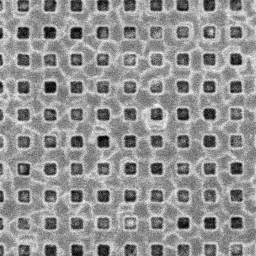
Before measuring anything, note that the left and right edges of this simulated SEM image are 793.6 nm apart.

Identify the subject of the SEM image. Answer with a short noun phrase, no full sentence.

a regular array of holes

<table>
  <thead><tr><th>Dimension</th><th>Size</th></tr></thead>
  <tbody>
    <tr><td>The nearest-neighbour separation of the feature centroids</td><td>81.8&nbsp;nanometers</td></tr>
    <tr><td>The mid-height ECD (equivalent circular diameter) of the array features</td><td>0.0454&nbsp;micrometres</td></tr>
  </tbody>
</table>